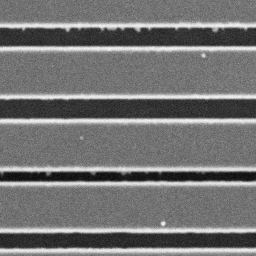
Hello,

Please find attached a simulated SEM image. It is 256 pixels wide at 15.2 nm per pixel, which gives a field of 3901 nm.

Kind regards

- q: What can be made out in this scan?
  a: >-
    lines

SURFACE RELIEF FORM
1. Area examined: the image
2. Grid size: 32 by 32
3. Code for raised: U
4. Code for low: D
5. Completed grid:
UUUUUUUUUUUUUUUUUUUUUUUUUUUUUUUU
UUUUUUUUUUUUUUUUUUUUUUUUUUUUUUUU
UUUUUUUUUUUUUUUUUUUUUUUUUUUUUUUU
DDDDDDDDDDDDDDDDDDDDDDDDDDDDDDDD
DDDDDDDDDDDDDDDDDDDDDDDDDDDDDDDD
DDDDDDDDDDDDDDDDDDDDDDDDDDDDDDDD
UUUUUUUUUUUUUUUUUUUUUUUUUUUUUUUU
UUUUUUUUUUUUUUUUUUUUUUUUUUUUUUUU
UUUUUUUUUUUUUUUUUUUUUUUUUUUUUUUU
UUUUUUUUUUUUUUUUUUUUUUUUUUUUUUUU
UUUUUUUUUUUUUUUUUUUUUUUUUUUUUUUU
UUUUUUUUUUUUUUUUUUUUUUUUUUUUUUUU
DDDDDDDDDDDDDDDDDDDDDDDDDDDDDDDD
DDDDDDDDDDDDDDDDDDDDDDDDDDDDDDDD
DDDDDDDDDDDDDDDDDDDDDDDDDDDDDDDD
UUUUUUUUUUUUUUUUUUUUUUUUUUUUUUUU
UUUUUUUUUUUUUUUUUUUUUUUUUUUUUUUU
UUUUUUUUUUUUUUUUUUUUUUUUUUUUUUUU
UUUUUUUUUUUUUUUUUUUUUUUUUUUUUUUU
UUUUUUUUUUUUUUUUUUUUUUUUUUUUUUUU
UUUUUUUUUUUUUUUUUUUUUUUUUUUUUUUU
DDDDDDDDDDDDDDDDDDDDDDDDDDDDDDDD
DDDDDDDDDDDDDDDDDDDDDDDDDDDDDDDD
UUUUUUUUUUUUUUUUUUUUUUUUUUUUUUUU
UUUUUUUUUUUUUUUUUUUUUUUUUUUUUUUU
UUUUUUUUUUUUUUUUUUUUUUUUUUUUUUUU
UUUUUUUUUUUUUUUUUUUUUUUUUUUUUUUU
UUUUUUUUUUUUUUUUUUUUUUUUUUUUUUUU
UUUUUUUUUUUUUUUUUUUUUUUUUUUUUUUU
DDDDDDDDDDDDDDDDDDDDDDDDDDDDDDDD
DDDDDDDDDDDDDDDDDDDDDDDDDDDDDDDD
UUUUUUUUUUUUUUUUUUUUUUUUUUUUUUUU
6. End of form